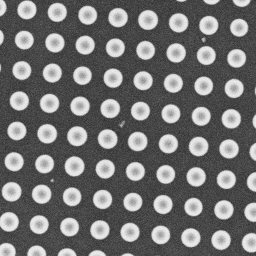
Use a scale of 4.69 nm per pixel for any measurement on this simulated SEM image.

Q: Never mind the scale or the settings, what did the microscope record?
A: an array of small figures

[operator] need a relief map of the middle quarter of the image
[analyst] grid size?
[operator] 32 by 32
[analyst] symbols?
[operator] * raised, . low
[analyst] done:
................................
...***.....**...................
..*****...****....***...........
..*****...*****...****...****...
...***....****....****...*****..
...........***....****...*****..
..........................***...
................................
...**...........................
..****....***...................
..****...*****...****.....**....
..****...*****...****....****...
...**.....***....****....****...
..................***....****...
..........................**....
................................
.****.....*.....................
.*****...****....***............
.*****...****...*****...****....
.****....****...*****...****....
.........****...****....****...*
.................**.....****...*
................................
.***............................
.****....***....................
*****...****....****.....*......
*****...*****...****....***....*
.***....****....****...*****...*
..........*.....***....*****...*
........................***....*
................................
.**.............................